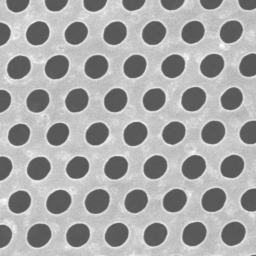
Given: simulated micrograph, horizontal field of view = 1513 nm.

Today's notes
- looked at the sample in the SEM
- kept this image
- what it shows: a regular array of holes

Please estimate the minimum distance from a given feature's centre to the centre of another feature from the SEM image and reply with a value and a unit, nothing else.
0.227 µm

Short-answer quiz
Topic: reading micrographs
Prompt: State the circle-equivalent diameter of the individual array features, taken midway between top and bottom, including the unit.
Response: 139 nm